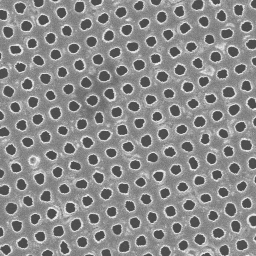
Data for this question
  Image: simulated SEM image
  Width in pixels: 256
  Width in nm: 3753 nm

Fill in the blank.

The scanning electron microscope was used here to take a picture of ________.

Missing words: a regular array of holes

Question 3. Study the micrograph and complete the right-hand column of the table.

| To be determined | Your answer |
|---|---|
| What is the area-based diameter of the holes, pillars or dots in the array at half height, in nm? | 147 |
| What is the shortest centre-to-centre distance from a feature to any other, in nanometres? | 264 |